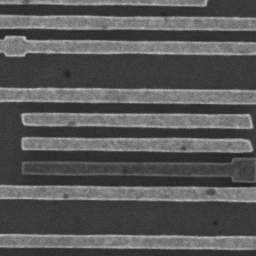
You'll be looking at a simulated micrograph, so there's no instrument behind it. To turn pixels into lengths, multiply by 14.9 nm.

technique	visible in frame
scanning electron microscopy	wiring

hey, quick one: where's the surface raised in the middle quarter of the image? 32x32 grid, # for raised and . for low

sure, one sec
................................
................................
................................
................................
................................
................................
#####################...........
################################
################################
......##########################
................................
................................
#########.......................
################################
################################
####.....#######################
................................
................................
................................
################################
################################
..........######################
................................
................................
................................
################################
################################
################################
................................
................................
................................
################################